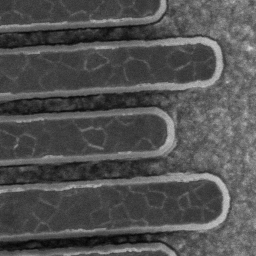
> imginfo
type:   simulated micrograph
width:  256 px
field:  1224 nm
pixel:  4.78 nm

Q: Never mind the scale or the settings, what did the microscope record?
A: one or a few lines or trenches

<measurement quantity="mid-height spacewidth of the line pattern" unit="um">0.106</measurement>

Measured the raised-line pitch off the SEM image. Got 0.333 micrometres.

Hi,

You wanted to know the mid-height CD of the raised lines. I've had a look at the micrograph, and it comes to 217 nm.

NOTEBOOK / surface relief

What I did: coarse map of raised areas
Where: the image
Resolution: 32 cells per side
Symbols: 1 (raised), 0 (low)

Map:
11111111111111111111000000000000
11111111111111111111000000000000
11111111111111111110000000000000
11110000000000000000000000000000
00000000000000000000000000000000
00000000000000011111111111100000
11111111111111111111111111100000
11111111111111111111111111100000
11111111111111111111111111100000
11111111111111111111111111100000
11111111111111111111111101000000
11111111111000000000000000000000
00000000000000000000000000000000
00000000000000000000000000000000
00000001111111111111100000000000
11111111111111111111100000000000
11111111111111111111100000000000
11111111111111111111100000000000
11111111111111111111100000000000
11111111111111100000000000000000
00000000000000000000000000000000
00000000000000000000000000000000
00000000000000000001111111100000
01111111111111111111111111110000
11111111111111111111111111110000
11111111111111111111111111110000
11111111111111111111111111110000
11111111111111111111111111100000
11111111111111111111110000000000
11111000000000000000000000000000
00000000000000000000000000000000
00000001111111111111100000000000